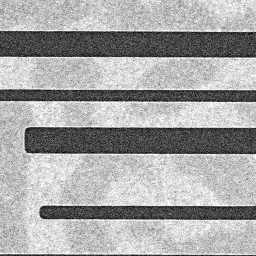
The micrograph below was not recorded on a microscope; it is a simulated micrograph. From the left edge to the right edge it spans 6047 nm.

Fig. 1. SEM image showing groups of lines, slits or small figures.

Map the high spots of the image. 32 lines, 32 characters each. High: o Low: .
oooooooooooooooooooooooooooooooo
oooooooooooooooooooooooooooooooo
oooooooooooooooooooooooooooooooo
oooooooooooooooooooooooooooooooo
................................
................................
................................
oooooooooooooooooooooooooooooooo
oooooooooooooooooooooooooooooooo
oooooooooooooooooooooooooooooooo
oooooooooooooooooooooooooooooooo
................................
................................
oooooooooooooooooooooooooooooooo
oooooooooooooooooooooooooooooooo
oooooooooooooooooooooooooooooooo
ooo.............................
ooo.............................
ooo.............................
oooooooooooooooooooooooooooooooo
oooooooooooooooooooooooooooooooo
oooooooooooooooooooooooooooooooo
oooooooooooooooooooooooooooooooo
oooooooooooooooooooooooooooooooo
oooooooooooooooooooooooooooooooo
oooooooooooooooooooooooooooooooo
ooooo...........................
oooooo..........................
oooooooooooooooooooooooooooooooo
oooooooooooooooooooooooooooooooo
oooooooooooooooooooooooooooooooo
oooooooooooooooooooooooooooooooo